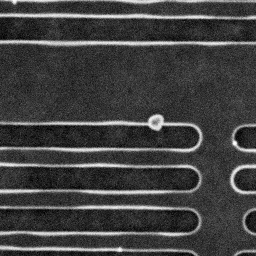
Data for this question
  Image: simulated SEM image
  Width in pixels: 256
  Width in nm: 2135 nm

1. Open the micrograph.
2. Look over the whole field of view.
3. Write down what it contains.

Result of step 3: groups of lines, slits or small figures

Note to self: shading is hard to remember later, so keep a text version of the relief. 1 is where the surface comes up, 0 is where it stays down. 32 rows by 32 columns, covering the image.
11111111111111111111111111111111
11111111111111111111111111111111
00000000000000000000000000000000
00000000000000000000000000000000
00000000000000000000000000000000
11111111111111111111111111111111
11111111111111111111111111111111
11111111111111111111111111111111
11111111111111111111111111111111
11111111111111111111111111111111
11111111111111111111111111111111
11111111111111111111111111111111
11111111111111111111111111111111
11111111111111111111111111111111
11111111111111111111111111111111
00000000000000000011101111111111
00000000000000000000000001111000
00000000000000000000000001111000
00000000000000000000000011111100
11111111111111111111111111111111
11111111111111111111111111111111
00000000000000000000000001111000
00000000000000000000000001111000
00000000000000000000000011111000
11111111111111111111111111111111
11111111111111111111111111111111
00000000000000000000000011111110
00000000000000000000000001111110
00000000000000000000000001111110
11111111111111111111111111111111
11111111111111111111111111111111
00000000000000000000000111111110